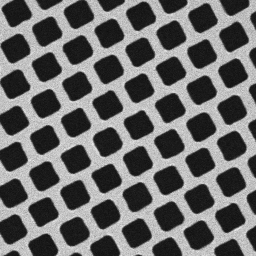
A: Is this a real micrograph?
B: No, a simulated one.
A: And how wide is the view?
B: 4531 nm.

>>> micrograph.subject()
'a regular array of holes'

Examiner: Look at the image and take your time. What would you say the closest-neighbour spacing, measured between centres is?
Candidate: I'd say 35.5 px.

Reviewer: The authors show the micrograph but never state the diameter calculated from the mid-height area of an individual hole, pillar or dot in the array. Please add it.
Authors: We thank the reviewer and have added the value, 495 nm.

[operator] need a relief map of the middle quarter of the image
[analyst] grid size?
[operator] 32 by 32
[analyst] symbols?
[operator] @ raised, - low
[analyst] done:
@@@@@@@--------@@--@@@@-------@@
@@@@@@@@-------@@@@@@@@-------@@
@@---@@@-------@@@@-@@@--------@
@-----@@@-----@@@----@@@------@@
------@@@---@@@-------@@@---@@@@
-------@@@@@@@@-------@@@@@@@@@-
-------@@@@@@@@--------@@@@@@@@-
@-----@@@@---@@@------@@@@--@@@-
@----@@@------@@-----@@@-----@@@
@@@@@@@-------@@@--@@@@-------@@
@@@@@@@--------@@@@@@@@-------@@
@@---@@@-------@@@@-@@@-------@@
-----@@@------@@@----@@@------@@
------@@@---@@@@-----@@@-----@@@
-------@@@@@@@@-------@@@--@@@@-
-------@@@@@@@@-------@@@@@@@@@-
------@@@@---@@@------@@@@--@@@-
@---@@@@------@@-----@@@-----@@@
@@@@@@@-------@@@---@@@------@@@
@@@@@@@--------@@@@@@@--------@@
@@@--@@@-------@@@@-@@@-------@@
@----@@@------@@@----@@-------@@
------@@@---@@@------@@@-----@@-
-------@@@@@@@@-------@@@--@@@--
-------@@@@@@@@-------@@@@@@@@--
------@@@@---@@-------@@@@--@@@-
@----@@@-----@@@-----@@@----@@@-
@@-@@@@-------@@@--@@@@------@@@
@@@@@@@-------@@@@@@@@--------@@
@@---@@@-------@@@@@@@@-------@@
-----@@@------@@@----@@-------@@
------@@@---@@@------@@@-----@@-